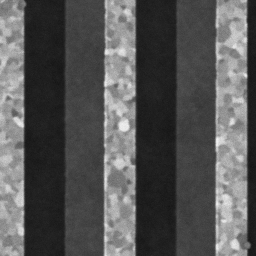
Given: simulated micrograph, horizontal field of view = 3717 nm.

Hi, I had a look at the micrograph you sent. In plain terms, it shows lines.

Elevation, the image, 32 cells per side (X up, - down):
XXX-----XXXXXXXXX-----XXXXXXXXX-
XXX-----XXXXXXXXX-----XXXXXXXXX-
XXX-----XXXXXXXXX-----XXXXXXXXX-
XXX-----XXXXXXXXX-----XXXXXXXXX-
XXX-----XXXXXXXXX-----XXXXXXXXX-
XXX-----XXXXXXXXX-----XXXXXXXXX-
XXX-----XXXXXXXXX-----XXXXXXXXX-
XXX-----XXXXXXXXX-----XXXXXXXXX-
XXX-----XXXXXXXXX-----XXXXXXXXX-
XXX-----XXXXXXXXX-----XXXXXXXXX-
XXX-----XXXXXXXXX-----XXXXXXXXX-
XXX-----XXXXXXXXX-----XXXXXXXXX-
XXX-----XXXXXXXXX-----XXXXXXXXX-
XXX-----XXXXXXXXX-----XXXXXXXXX-
XXX-----XXXXXXXXX-----XXXXXXXXX-
XXX-----XXXXXXXXX-----XXXXXXXXX-
XXX-----XXXXXXXXX-----XXXXXXXXX-
XXX-----XXXXXXXXX-----XXXXXXXXX-
XXX-----XXXXXXXXX-----XXXXXXXXX-
XXX-----XXXXXXXXX-----XXXXXXXXX-
XXX-----XXXXXXXXX-----XXXXXXXXX-
XXX-----XXXXXXXXX-----XXXXXXXXX-
XXX-----XXXXXXXXX-----XXXXXXXXX-
XXX-----XXXXXXXXX-----XXXXXXXXX-
XXX-----XXXXXXXXX-----XXXXXXXXX-
XXX-----XXXXXXXXX-----XXXXXXXXX-
XXX-----XXXXXXXXX-----XXXXXXXXX-
XXX-----XXXXXXXXX-----XXXXXXXXX-
XXX-----XXXXXXXXX-----XXXXXXXXX-
XXX-----XXXXXXXXX-----XXXXXXXXX-
XXX-----XXXXXXXXX-----XXXXXXXXX-
XXX-----XXXXXXXXX-----XXXXXXXXX-